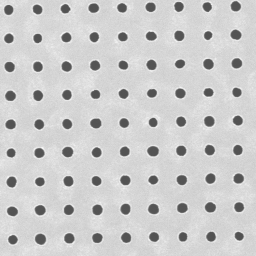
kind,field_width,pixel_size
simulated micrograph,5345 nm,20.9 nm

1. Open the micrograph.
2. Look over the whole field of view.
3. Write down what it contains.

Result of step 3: a regular array of holes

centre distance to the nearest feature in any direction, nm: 588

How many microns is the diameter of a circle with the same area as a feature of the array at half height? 0.211